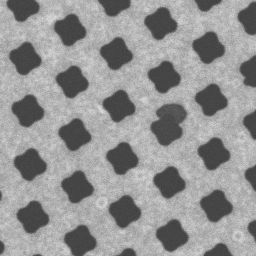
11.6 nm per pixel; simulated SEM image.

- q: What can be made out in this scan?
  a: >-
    a regular array of holes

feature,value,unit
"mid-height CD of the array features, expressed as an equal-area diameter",0.352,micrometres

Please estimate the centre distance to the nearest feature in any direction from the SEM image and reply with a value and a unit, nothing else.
52.3 px